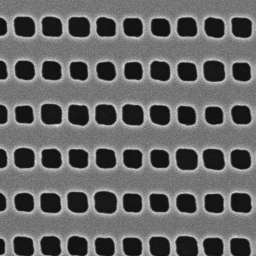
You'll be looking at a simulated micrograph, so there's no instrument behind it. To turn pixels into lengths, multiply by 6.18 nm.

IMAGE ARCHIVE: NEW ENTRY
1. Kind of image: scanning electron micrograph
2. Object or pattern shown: a regular array of holes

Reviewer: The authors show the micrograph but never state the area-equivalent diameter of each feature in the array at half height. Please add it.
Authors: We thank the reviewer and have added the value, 0.131 micrometres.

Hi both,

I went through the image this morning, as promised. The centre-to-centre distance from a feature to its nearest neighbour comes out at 0.167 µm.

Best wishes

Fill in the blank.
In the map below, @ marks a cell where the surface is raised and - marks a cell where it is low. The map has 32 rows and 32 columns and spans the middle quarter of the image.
@-----@@-----@@----@@@----@@----
@-----@@-----@@-----@------@----
@-----@@-----@@-----@------@----
@@----@@@----@@----@@@----@@@---
@@@@@@@@@@@@@@@@@@@@@@@@@@@@@@@@
@@@@@@@@@@@@@@@@@@@@@@@@@@@@@@@@
@@@@@@@@@@@@@@@@@@@@@@@@@@@@@@@@
@@@@@@@@@@@@@@@@@@@@@@@@@@@@@@@@
@@@@@@@@@@@@@@@@@@@@@@@@@@@@@@@@
@@@@@@@@@@@@@@@@@@@@@@@@@@@@@@@@
@----@@@----@@@----@@@----@@@---
@-----@@-----@------@-----@@----
@-----@@-----@------@------@----
@-----@@-----@------@@-----@----
@-----@@-----@@-----@@----@@@---
@@@@-@@@@@@@@@@@@@-@@@@@@@@@@@@@
@@@@@@@@@@@@@@@@@@@@@@@@@@@@@@@@
@@@@@@@@@@@@@@@@@@@@@@@@@@@@@@@@
@@@@@@@@@@@@@@@@@@@@@@@@@@@@@@@@
@@@@@@@@@@@@@@@@@@@@@@@@@@@@@@@@
@@@@@@@@@@@@@@@@@@@@@@@@@@@@@@@@
@----@@@----@@@----@@@---@@@----
@-----@@-----@@-----@-----@@----
@-----@@-----@@-----@-----@@----
@-----@@-----@@-----@@----@@----
@@----@@-----@@----@@@----@@----
@@@@@@@@@@@@@@@@@@@@@@@@@@@@@@--
@@@@@@@@@@@@@@@@@@@@@@@@@@@@@@@@
@@@@@@@@@@@@@@@@@@@@@@@@@@@@@@@@
@@@@@@@@@@@@@@@@@@@@@@@@@@@@@@@@
@@@@@@@@@@@@@@@@@@@@@@@@@@@@@@@@
@@@@@@@@@@@@@@@@@@@@@@@@@@@@@@@@